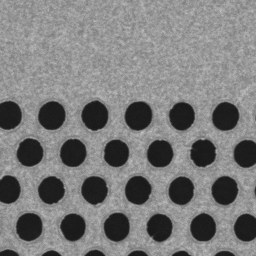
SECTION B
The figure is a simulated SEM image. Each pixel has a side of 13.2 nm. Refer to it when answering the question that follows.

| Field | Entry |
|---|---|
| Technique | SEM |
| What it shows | a regular array of holes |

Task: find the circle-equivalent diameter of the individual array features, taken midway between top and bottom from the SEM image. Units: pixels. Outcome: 27.8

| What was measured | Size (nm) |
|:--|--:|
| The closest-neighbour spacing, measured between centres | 563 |